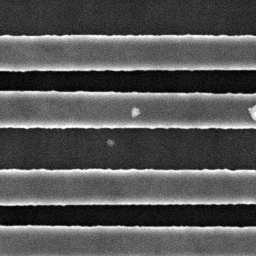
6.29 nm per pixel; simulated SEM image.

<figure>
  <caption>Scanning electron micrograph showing lines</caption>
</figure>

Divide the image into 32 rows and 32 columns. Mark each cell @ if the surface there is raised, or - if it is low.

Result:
--------------------------------
--------------------------------
--------------------------------
--------------------------------
@@@--@@-@@@@@@@@@@@@@@@@@@@@@@@@
@@@@@@@@@@@@@@@@@@@@@@@@@@@@@@@@
@@@@@@@@@@@@@@@@@@@@@@@@@@@@@@@@
@@@@@@@@@@@@@@@@@@@@@@@@@@@@@@@@
@@@@@@@@@@@@@@@@@@@@@@@@@@@@@@@@
--------------------------------
--------------------------------
@@@@@@@@-@@---------------------
@@@@@@@@@@@@@@@@@@@@@@@@@@@@@@@@
@@@@@@@@@@@@@@@@@@@@@@@@@@@@@@@@
@@@@@@@@@@@@@@@@@@@@@@@@@@@@@@@@
@@@@@@@@@@@@@@@@@@@@@@@@@@@@@@@@
--------------------------------
--------------------------------
--------------------------------
--------------------------------
--------------------------------
@@@@@@@@@@@@@@@@@@@@@@@@@@@@@@@@
@@@@@@@@@@@@@@@@@@@@@@@@@@@@@@@@
@@@@@@@@@@@@@@@@@@@@@@@@@@@@@@@@
@@@@@@@@@@@@@@@@@@@@@@@@@@@@@@@@
@@@@@@@@@@@@@@@@@@@@@@@@@@@@@@-@
--------------------------------
--------------------------------
@@@@@@@@@@@@@@@@@@@@@@@@@@@@@@@@
@@@@@@@@@@@@@@@@@@@@@@@@@@@@@@@@
@@@@@@@@@@@@@@@@@@@@@@@@@@@@@@@@
@@@@@@@@@@@@@@@@@@@@@@@@@@@@@@@@